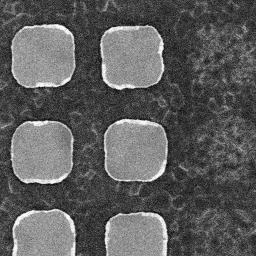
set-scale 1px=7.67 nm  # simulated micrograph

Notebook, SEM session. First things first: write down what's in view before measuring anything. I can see raised bodies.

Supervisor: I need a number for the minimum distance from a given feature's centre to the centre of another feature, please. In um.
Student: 0.697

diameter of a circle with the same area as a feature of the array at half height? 508 nm